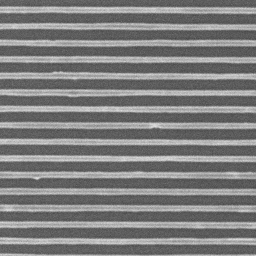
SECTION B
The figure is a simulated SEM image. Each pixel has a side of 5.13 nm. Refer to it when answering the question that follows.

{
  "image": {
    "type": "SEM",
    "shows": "parallel lines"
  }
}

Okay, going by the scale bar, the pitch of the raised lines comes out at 84.8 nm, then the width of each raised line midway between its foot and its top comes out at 5.5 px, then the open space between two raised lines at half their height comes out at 56.4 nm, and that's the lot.